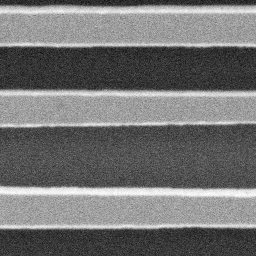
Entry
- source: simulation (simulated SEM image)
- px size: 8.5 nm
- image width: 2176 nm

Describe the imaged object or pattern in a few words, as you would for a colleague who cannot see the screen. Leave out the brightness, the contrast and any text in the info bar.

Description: lines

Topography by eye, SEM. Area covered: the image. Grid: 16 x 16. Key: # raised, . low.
................
################
################
................
................
................
################
################
................
................
................
................
################
################
................
................